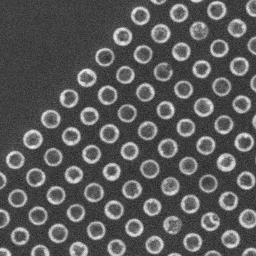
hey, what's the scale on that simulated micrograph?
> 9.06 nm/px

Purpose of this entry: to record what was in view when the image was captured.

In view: a regular array of raised bodies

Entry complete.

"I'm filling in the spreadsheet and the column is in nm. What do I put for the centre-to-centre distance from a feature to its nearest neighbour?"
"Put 242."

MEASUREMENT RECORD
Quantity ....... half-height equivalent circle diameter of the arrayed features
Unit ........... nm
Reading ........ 153